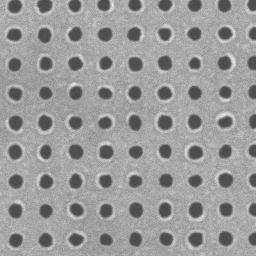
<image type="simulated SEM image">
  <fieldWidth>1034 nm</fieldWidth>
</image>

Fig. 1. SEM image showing a regular array of holes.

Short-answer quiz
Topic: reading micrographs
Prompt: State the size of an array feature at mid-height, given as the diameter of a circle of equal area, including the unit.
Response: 56.6 nm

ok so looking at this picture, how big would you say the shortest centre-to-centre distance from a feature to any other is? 117 nanometers